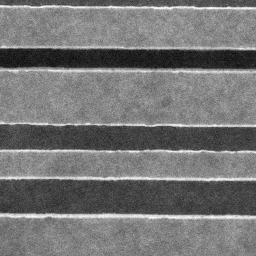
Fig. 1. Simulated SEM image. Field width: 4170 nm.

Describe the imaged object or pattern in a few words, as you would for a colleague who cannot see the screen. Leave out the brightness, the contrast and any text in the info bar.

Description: lines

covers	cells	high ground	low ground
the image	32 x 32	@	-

--------------------------------
@@@@@@@@@@@@@@@@@@@@@@@@@@@@@@@@
@@@@@@@@@@@@@@@@@@@@@@@@@@@@@@@@
@@@@@@@@@@@@@@@@@@@@@@@@@@@@@@@@
@@@@@@@@@@@@@@@@@@@@@@@@@@@@@@@@
@@@@@@@@@@@@@@@@@@@@@@@@@@@@@@@@
--------------------------------
--------------------------------
--------------------------------
@@@@@@@@@@@@@@@@@@@@@@@@@@@@@@@@
@@@@@@@@@@@@@@@@@@@@@@@@@@@@@@@@
@@@@@@@@@@@@@@@@@@@@@@@@@@@@@@@@
@@@@@@@@@@@@@@@@@@@@@@@@@@@@@@@@
@@@@@@@@@@@@@@@@@@@@@@@@@@@@@@@@
@@@@@@@@@@@@@@@@@@@@@@@@@@@@@@@@
----@@@@@@@@@@@@@@@@@@@@@@@@@@@@
--------------------------------
--------------------------------
--------------------------------
@@@@@@@@@@@@@@@@@@@@@@@@@@@@@@@@
@@@@@@@@@@@@@@@@@@@@@@@@@@@@@@@@
@@@@@@@@@@@@@@@@@@@@@@@@@@@@@@@@
--------------------------------
--------------------------------
--------------------------------
--------------------------------
--------------------------------
@@@@@@@@@@@@@@@@@@@@@@@@@@@@@@@@
@@@@@@@@@@@@@@@@@@@@@@@@@@@@@@@@
@@@@@@@@@@@@@@@@@@@@@@@@@@@@@@@@
@@@@@@@@@@@@@@@@@@@@@@@@@@@@@@@@
@@@@@@@@@@@@@@@@@@@@@@@@@@@@@@@@